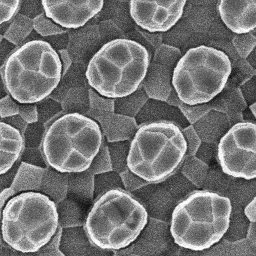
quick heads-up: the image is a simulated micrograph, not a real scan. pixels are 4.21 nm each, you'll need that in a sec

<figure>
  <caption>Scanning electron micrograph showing a regular array of raised bodies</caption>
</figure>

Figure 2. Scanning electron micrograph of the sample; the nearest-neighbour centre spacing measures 348 nm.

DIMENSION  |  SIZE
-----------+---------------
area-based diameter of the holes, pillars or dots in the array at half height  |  57 pixels